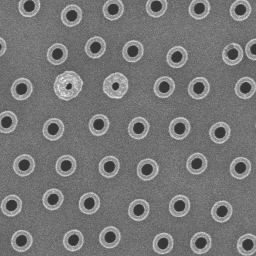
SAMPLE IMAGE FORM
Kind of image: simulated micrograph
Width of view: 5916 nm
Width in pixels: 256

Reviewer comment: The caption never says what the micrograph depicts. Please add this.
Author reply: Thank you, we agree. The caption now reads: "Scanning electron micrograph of a regular array of ring-shaped raised bodies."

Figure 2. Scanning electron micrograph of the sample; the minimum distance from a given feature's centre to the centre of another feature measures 876 nanometers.